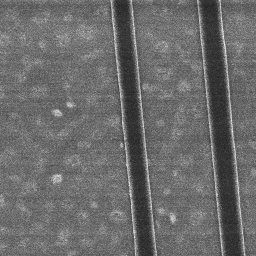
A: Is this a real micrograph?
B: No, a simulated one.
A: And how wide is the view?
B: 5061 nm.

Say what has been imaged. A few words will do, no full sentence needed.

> one or a few lines or trenches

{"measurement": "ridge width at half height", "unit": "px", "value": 21.8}